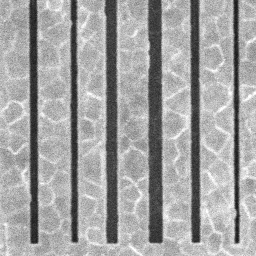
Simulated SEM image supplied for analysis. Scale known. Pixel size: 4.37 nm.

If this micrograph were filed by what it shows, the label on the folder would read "parallel lines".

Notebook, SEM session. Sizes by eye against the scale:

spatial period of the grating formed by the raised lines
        40.7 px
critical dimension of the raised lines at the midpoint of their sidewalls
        29.5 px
